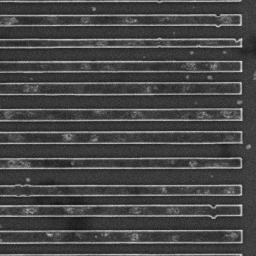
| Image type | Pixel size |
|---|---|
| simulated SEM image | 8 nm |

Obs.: parallel lines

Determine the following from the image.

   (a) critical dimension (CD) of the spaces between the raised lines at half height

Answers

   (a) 109 nm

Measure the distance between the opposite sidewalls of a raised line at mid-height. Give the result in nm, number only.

87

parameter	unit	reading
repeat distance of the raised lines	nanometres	192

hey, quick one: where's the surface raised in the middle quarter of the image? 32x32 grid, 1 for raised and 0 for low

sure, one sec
11111111111111111111111111111111
11111111111111111111111111111111
00000000000000000000000000000000
00000000000000000000000000000000
00000000000000000000000000000000
11111111111111111111111111111111
11111111111111111111111111111111
11111111111111111111111111111111
00000000000000000000000000000000
00000000000000000000000000000000
00000000000000000000000000000000
11101000111111111111111111111111
11111111111111111111111111111111
11111111111111111111111111111111
00000000000000000000000000000000
00000000000000000000000000000000
00000000000000000000000000000000
11111111111111111111111111111111
11111111111111111111111111111111
11111111111111111111111111111111
00000000000000000000000000000000
00000000000000000000000000000000
00000000000000000000000000000000
00000000000000000000000000000000
11111111111111111111111111111111
11111111111111111111111111111111
00000000000000000000000000000000
00000000000000000000000000000000
00000000000000000000000000000000
00000000000000000000000000000000
00000000000000000000000000000000
11111111111111111111111111111111